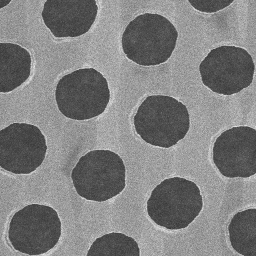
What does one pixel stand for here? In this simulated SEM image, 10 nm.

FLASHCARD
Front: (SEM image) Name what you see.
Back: holes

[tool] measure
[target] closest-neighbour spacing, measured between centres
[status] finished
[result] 0.824 micrometres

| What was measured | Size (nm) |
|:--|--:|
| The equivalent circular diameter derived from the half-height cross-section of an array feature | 537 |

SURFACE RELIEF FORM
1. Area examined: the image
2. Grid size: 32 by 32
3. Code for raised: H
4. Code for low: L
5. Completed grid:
LHHHHHLLLLLLHHHHHHHHHHHHLLLLLHHH
HHHHHLLLLLLLHHHHHHHHHHHHHLLHHHHH
HHHHHLLLLLLLHHHHHLLLLHHHHHHHHHHH
HHHHHHLLLLLHHHHHLLLLLLHHHHHHHHHH
HHHHHHHLLLHHHHHLLLLLLLHHHHHHHHHH
LLHHHHHHHHHHHHHLLLLLLLHHHHHHHHHH
LLLLHHHHHHHHHHHLLLLLLLHHHHLLLLLH
LLLLHHHHHHHHHHHHLLLLLHHHHLLLLLLL
LLLLHHHHHHHHHHHHHHHHHHHHHLLLLLLL
LLLLHHHHLLLLLHHHHHHHHHHHHLLLLLLL
LLLHHHHLLLLLLLHHHHHHHHHHHHLLLLLH
LHHHHHHLLLLLLLHHHHHHHHHHHHHLLLHH
HHHHHHHLLLLLLLHHHHLLLLHHHHHHHHHH
HHHHHHHLLLLLLHHHHLLLLLLHHHHHHHHH
HHHHHHHHLLLLHHHHHLLLLLLLHHHHHHHH
HLLLHHHHHHHHHHHHHLLLLLLLHHHHHHHH
LLLLLHHHHHHHHHHHHLLLLLLHHHHHLLLL
LLLLLLHHHHHHHHHHHHLLLLLHHHHLLLLL
LLLLLLHHHHHHHHHHHHHHHHHHHHHLLLLL
LLLLLLHHHHLLLLLHHHHHHHHHHHHLLLLL
LLLLLHHHHHLLLLLLHHHHHHHHHHHLLLLL
HLLLHHHHHLLLLLLLHHHHHHHHHHHHLLLL
HHHHHHHHHLLLLLLLHHHHLLLHHHHHHHHH
HHHHHHHHHLLLLLLLHHHLLLLLLHHHHHHH
HHHHHHHHHHLLLLHHHHHLLLLLLHHHHHHH
HHHHHHHHHHHHHHHHHHLLLLLLLHHHHHHH
HHLLLLLHHHHHHHHHHHLLLLLLLHHHHHLL
HLLLLLLLHHHHHHHHHHHLLLLLHHHHHLLL
HLLLLLLLHHHHHHHHHHHHHLLHHHHHHLLL
HLLLLLLLHHHHHLLLHHHHLHHHHHHHHLLL
HLLLLLLHHHHHLLLLLHHHHHHHHHHHHLLL
HHHLLLHHHHHLLLLLLHHHHHHHHHHHHHLL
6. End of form